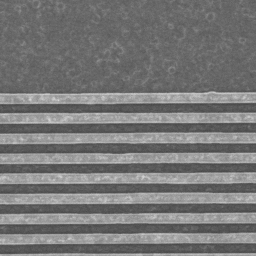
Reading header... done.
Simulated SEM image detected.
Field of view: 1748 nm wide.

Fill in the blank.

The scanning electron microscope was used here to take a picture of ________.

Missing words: parallel lines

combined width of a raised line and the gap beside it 137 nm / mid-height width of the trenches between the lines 73.4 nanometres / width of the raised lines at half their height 9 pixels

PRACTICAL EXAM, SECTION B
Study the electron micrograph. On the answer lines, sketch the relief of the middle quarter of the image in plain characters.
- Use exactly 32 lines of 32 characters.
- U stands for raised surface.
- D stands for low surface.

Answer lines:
DDDDDDDDDDDDDDDDDDDDDDDDDDDDDDDD
DDDDDDDDDDDDDDDDDDDDDDDDDDDDDDDD
DDDDDDDDDDDDDDDDDDDDDDDDDDDDDDDD
DDDDDDDDDDDDDDDDDDDDDDDDDDDDDDDD
DDDDDDDDDDDDDDDDDDDDDDDDDDDDDDDD
DDDDDDDDDDDDDDDDDDDDDDDDDDDDDDDD
DDDDDDDDDDDDDDDDDDDDDDDDDDDDDDDD
DDDDDDDDDDDDDDDDDDDDDDDDDDDUUUUU
UUUUUUUUUUUUUUUUUUUUUUUUUUUUUUUU
UUUUUUUUUUUUUUUUUUUUUUUUUUDDDDDU
DDDDDDDDDDDDDDDDDDDDDDDDDDDDDDDD
DDDDDDDDDDDDDDDDDDDDDDDDDDDDDDDD
DDDDDDDDDDDDUUUUUUUUUUUUUUUUUUUU
UUUUUUUUUUUUUUUUUUUUUUUUUUUUUUUU
UUUUUUUUUUUUDDDDDDDDDDDDDDUUUUUU
DDDDDDDDDDDDDDDDDDDDDDDDDDDDDDDD
DDDDDDDDDDDDDDDDDDDDDDDDDDDDDDDD
UUUUUUUUUUUUUUUUUUUUUUUUUUUUUUUU
UUUUUUUUUUUUUUUUUUUUUUUUUUUUUUUU
UUUUUUUDDUUUUUUUUUUUUUUUUUUUUUUU
DDDDDDDDDDDDDDDDDDDDDDDDDDDDDDDD
DDDDDDDDDDDDDDDDDDDDDDDDDDDDDDDD
DDDDDDDDDDDDDDDDDDDUUDDDDDDDDDDD
UUUUUUUUUUUUUUUUUUUUUUUUUUUUUUUU
UUUUUUUUUUUUUUUUUUUUUUUUUUUUUUUU
DDDDDDDDDDDDDDDDDDDDDDDDDDDDDDDD
DDDDDDDDDDDDDDDDDDDDDDDDDDDDDDDD
DDDDDDDDDDDDDDDDDDDDDDDUUUUUUUUU
UUUUUUUUUUUUUUUUUUUUUUUUUUUUUUUU
UUUUUUUUUUUUUUUUUUUUUUUUUUUUUUUU
DDDDDDDDDDDDDDDDDDDDDDDDDDDDDDDD
DDDDDDDDDDDDDDDDDDDDDDDDDDDDDDDD